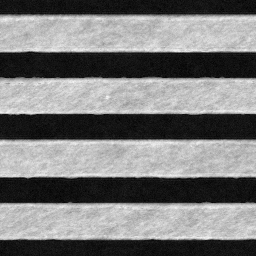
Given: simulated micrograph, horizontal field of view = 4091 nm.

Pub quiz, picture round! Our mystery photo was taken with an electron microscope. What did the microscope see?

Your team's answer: lines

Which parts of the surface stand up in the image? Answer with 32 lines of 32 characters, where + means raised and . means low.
................................
................................
++++++++++++++++++++++++++++++++
++++++++++++++++++++++++++++++++
++++++++++++++++++++++++++++++++
++++++++++++++++++++++++++++++++
................................
................................
................................
................................
++++++++++++++++++++++++++++++++
++++++++++++++++++++++++++++++++
++++++++++++++++++++++++++++++++
++++++++++++++++++++++++++++++++
................................
................................
................................
................................
++++++++++++++++++++++++++++++++
++++++++++++++++++++++++++++++++
++++++++++++++++++++++++++++++++
++++++++++++++++++++++++++++++++
................................
................................
................................
++++++++++++++++++++++++++++++++
++++++++++++++++++++++++++++++++
++++++++++++++++++++++++++++++++
++++++++++++++++++++++++++++++++
++++++++++++++++++++++++++++++++
................................
................................